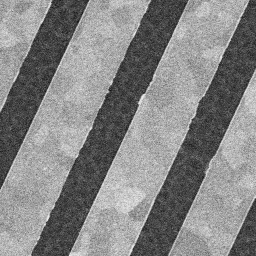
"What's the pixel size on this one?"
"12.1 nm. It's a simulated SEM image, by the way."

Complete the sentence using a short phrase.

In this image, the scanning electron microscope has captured one or a few lines or trenches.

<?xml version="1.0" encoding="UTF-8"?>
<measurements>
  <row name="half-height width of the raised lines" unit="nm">655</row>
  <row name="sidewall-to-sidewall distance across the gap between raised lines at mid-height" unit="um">0.433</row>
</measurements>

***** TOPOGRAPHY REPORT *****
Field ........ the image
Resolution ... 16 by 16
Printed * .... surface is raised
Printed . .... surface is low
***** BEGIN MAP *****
***..****...***.
***..****..****.
**..****...***..
**..****..****..
*..****...***...
*..****..****..*
...***...***...*
..****..****...*
..***...****..**
.****..****...**
.***...****..***
****..****...***
****..****..****
***..****...***.
***..****..****.
**...***...***..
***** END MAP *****